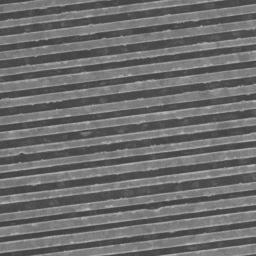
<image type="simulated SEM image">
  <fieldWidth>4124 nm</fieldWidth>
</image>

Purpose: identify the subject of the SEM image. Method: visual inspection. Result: parallel lines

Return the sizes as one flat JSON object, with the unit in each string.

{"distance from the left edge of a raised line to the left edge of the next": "255 nm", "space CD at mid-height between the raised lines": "124 nm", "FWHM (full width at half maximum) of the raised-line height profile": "136 nanometres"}